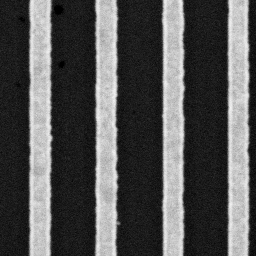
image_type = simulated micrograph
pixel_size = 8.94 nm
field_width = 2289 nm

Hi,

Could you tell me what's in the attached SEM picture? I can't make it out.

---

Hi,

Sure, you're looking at lines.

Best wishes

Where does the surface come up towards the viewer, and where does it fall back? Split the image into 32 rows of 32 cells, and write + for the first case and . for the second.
....++......++......+++......++.
....++......++......+++......++.
....++......+++.....+++......++.
....++......++......+++......++.
....++......+++......++......++.
....++......++......+++......++.
....++......++.......++......++.
....++......+++.....+++......++.
....++......++......+++......++.
....++......+++.....+++......++.
....++......++......+++......++.
....++......++......+++......++.
....++......++......+++......++.
....++......++......+++......++.
....++......++......+++......++.
....++......++......+++......++.
....++......++......+++......++.
....++......++......+++......++.
....++......++......+++......++.
....++......++......+++......++.
....++......++......+++......++.
....++......++......+++......++.
....++......+++......++......++.
....++......+++......++......++.
....++......++......+++......++.
....++......++......+++......++.
....++......++......+++......++.
....++......++......+++......++.
....++......++......+++......++.
....++......++......+++......++.
....++......++.......++......++.
....++......++......+++......++.